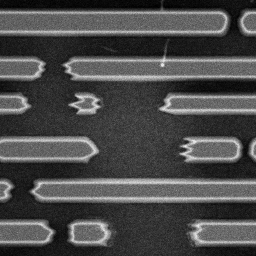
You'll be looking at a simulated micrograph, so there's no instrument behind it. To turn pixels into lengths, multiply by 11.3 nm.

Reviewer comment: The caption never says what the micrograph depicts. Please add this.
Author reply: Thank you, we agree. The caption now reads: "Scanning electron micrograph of parallel lines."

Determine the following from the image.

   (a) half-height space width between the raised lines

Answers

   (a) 264 nanometres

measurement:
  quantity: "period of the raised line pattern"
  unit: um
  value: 0.476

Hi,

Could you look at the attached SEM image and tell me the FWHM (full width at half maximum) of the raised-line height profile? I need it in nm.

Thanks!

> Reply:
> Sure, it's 239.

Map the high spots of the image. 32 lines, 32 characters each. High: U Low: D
DDDDDDDDDDDDDDDDDDDDDDDDDDDDDDDD
UUUUUUUUUUUUUUUUUUUUUUUUUUUUDDDU
UUUUUUUUUUUUUUUUUUUUUUUUUUUUUDUU
UUUUUUUUUUUUUUUUUUUUUUUUUUUUDDUU
DDDDDDDDDDDDDDDDDDDDDDDDDDDDDDDD
DDDDDDDDDDDDDDDDDDDDDDDDDDDDDDDD
DDDDDDDDDDDDDDDDDDDDDDDDDDDDDDDD
UUUUUDDDDUUUUUUUUUUUUUUUUUUUUUUU
UUUUUDDDUUUUUUUUUUUUUUUUUUUUUUUU
UUUUUDDDDUUUUUUUUUUUUUUUUUUUUUUU
DDDDDDDDDDDDDDDDDDDDDDDDDDDDDDDD
DDDDDDDDDDDDDDDDDDDDDDDDDDDDDDDD
UUUDDDDDDDUUDDDDDDDDDUUUUUUUUUUU
UUUDDDDDDDUUDDDDDDDDDUUUUUUUUUUU
DDDDDDDDDDDDDDDDDDDDDDDDDDDDDDDD
DDDDDDDDDDDDDDDDDDDDDDDDDDDDDDDD
DDDDDDDDDDDDDDDDDDDDDDDDDDDDDDDD
UUUUUUUUUUUDDDDDDDDDDDDDUUUUUDDD
UUUUUUUUUUUUDDDDDDDDDDDUUUUUUUDU
UUUUUUUUUUUDDDDDDDDDDDDUUUUUUUDU
DDDDDDDDDDDDDDDDDDDDDDDDDDDDDDDD
DDDDDDDDDDDDDDDDDDDDDDDDDDDDDDDD
DDDDDDDDDDDDDDDDDDDDDDDDDDDDDDDD
UDDDUUUUUUUUUUUUUUUUUUUUUUUUUUUU
UDDDUUUUUUUUUUUUUUUUUUUUUUUUUUUU
DDDDDDDDDDDDDDDDDDDDDDDDDDDDDDDD
DDDDDDDDDDDDDDDDDDDDDDDDDDDDDDDD
DDDDDDDDDDDDDDDDDDDDDDDDDDDDDDDD
UUUUUUDDDUUUUDDDDDDDDDDDDUUUUUUU
UUUUUUUDDUUUUDDDDDDDDDDDUUUUUUUU
DDDDDDDDDDDDDDDDDDDDDDDDDUUUUUUU
DDDDDDDDDDDDDDDDDDDDDDDDDDDDDDDD